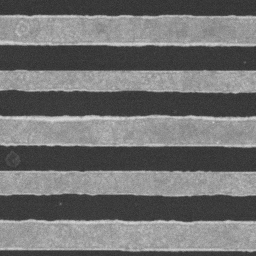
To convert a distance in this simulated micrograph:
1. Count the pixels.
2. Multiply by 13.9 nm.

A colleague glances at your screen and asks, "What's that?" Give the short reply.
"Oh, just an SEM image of lines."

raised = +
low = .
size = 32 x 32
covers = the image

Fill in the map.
................................
................................
++++++++++++++++++++++++++++++++
++++++++++++++++++++++++++++++++
++++++++++++++++++++++++++++++++
....+.++++++++++++++++++++++++++
................................
................................
................................
++++++++++++++++++++++++++++++++
++++++++++++++++++++++++++++++++
.............................+..
................................
................................
....................+...........
++++++++++++++++++++++++++++++++
++++++++++++++++++++++++++++++++
++++++++++++++++++++++++++++++++
................................
................................
................................
+++++.......++++++.......+......
++++++++++++++++++++++++++++++++
++++++++++++++++++++++++++++++++
................................
................................
................................
................................
++++++++++++++++++++++++++++++++
++++++++++++++++++++++++++++++++
++++++++++++++++++++++++++++++++
................................